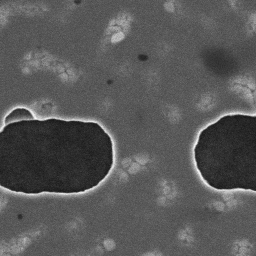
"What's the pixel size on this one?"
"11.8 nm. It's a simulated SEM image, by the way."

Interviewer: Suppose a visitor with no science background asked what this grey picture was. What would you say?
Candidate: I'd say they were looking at holes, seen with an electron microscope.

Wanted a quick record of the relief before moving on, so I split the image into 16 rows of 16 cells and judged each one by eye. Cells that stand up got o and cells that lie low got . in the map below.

oooooooooooooooo
oooooooooooooooo
oooooooooooooooo
oooooooooooooooo
oooooooooooooooo
oooooooooooooooo
oooooooooooooooo
....oooooooooo..
.......ooooo....
.......ooooo....
.......ooooo....
......ooooooo...
oooooooooooooooo
oooooooooooooooo
oooooooooooooooo
oooooooooooooooo